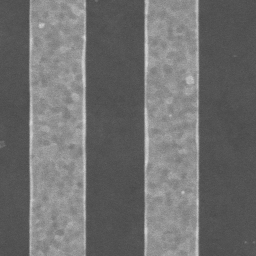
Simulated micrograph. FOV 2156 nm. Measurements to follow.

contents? wiring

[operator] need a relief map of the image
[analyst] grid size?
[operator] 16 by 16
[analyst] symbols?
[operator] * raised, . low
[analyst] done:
..***....***....
..***....***....
..***....***....
..***....***....
..***....***....
..***....***....
..***....***....
..***....***....
..***....***....
..***....***....
..***....***....
..***....***....
..***....***....
..***....***....
..***....***....
..***....***....